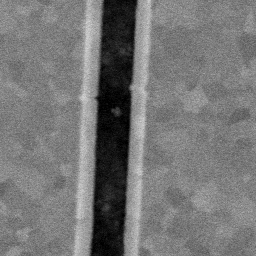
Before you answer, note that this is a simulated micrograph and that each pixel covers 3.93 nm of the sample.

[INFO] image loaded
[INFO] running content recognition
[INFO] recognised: one or a few lines or trenches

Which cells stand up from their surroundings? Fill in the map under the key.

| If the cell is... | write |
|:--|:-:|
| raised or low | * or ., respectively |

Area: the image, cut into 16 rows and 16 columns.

******...*******
******...*******
******...*******
******...*******
******...*******
******...*******
******...*******
******...*******
*****....*******
*****....*******
*****...********
*****...********
*****...********
*****...********
*****...********
*****...********